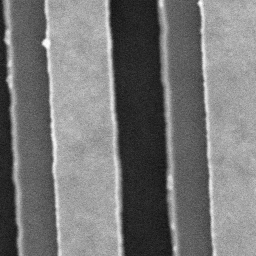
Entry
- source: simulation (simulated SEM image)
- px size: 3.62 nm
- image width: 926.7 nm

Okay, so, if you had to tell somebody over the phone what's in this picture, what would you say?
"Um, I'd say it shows lines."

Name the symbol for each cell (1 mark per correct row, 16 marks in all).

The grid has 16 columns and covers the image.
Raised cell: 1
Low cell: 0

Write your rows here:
1111111000111111
1111111000111111
1111111000111111
0111111000111111
0111111000111111
0111111000111111
0111111000111111
0111111000111111
0111111000111111
0111111000011111
0111111000011111
0111111000111111
0111111000011111
0111111000011111
0111111100011111
0111111100011111